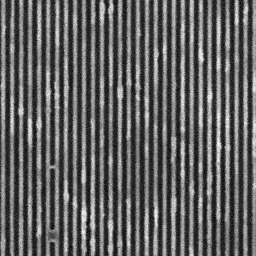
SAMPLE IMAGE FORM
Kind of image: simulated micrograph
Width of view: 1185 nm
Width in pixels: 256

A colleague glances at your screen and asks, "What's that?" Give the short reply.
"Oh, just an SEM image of parallel lines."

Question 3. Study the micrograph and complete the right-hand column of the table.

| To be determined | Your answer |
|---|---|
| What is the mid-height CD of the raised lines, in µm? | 0.0156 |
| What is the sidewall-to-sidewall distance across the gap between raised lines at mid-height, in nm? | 27.8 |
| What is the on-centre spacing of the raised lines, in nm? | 41.6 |